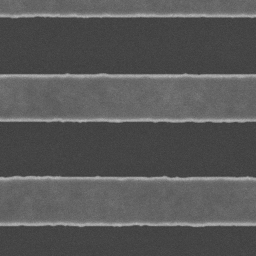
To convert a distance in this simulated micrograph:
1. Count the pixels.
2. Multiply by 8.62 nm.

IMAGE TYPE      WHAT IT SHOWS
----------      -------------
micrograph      lines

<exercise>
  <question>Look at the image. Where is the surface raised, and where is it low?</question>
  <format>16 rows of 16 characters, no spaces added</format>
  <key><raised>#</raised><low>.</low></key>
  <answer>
################
................
................
................
................
################
################
################
................
................
................
################
################
################
................
................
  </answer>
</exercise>